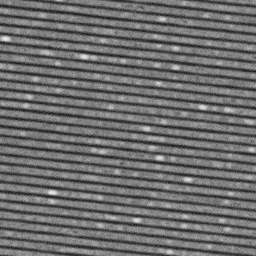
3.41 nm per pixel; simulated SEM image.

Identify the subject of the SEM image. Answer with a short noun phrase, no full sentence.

parallel lines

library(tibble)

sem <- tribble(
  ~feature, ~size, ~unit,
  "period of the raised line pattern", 31.4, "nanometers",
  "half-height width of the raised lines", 20.8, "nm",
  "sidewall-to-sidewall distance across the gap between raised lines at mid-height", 9.7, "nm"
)